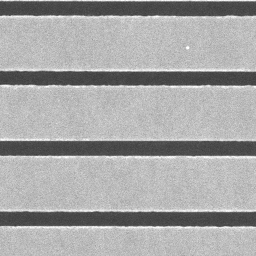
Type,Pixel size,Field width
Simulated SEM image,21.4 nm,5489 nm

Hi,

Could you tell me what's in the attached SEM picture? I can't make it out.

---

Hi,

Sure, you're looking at lines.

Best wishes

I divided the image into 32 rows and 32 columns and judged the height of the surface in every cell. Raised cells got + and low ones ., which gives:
................................
................................
++++++++++++++++++++++++++++++++
++++++++++++++++++++++++++++++++
++++++++++++++++++++++++++++++++
++++++++++++++++++++++++++++++++
++++++++++++++++++++++++++++++++
++++++++++++++++++++++++++++++++
++++++++++++++++++++++++++++++++
................................
................................
++++++++++++++++++++++++++++++++
++++++++++++++++++++++++++++++++
++++++++++++++++++++++++++++++++
++++++++++++++++++++++++++++++++
++++++++++++++++++++++++++++++++
++++++++++++++++++++++++++++++++
++++++++++++++++++++++++++++++++
................................
.+..........+...................
++++++++++++++++++++++++++++++++
++++++++++++++++++++++++++++++++
++++++++++++++++++++++++++++++++
++++++++++++++++++++++++++++++++
++++++++++++++++++++++++++++++++
++++++++++++++++++++++++++++++++
................................
................................
++++++++++++++++++++++++++++++++
++++++++++++++++++++++++++++++++
++++++++++++++++++++++++++++++++
++++++++++++++++++++++++++++++++